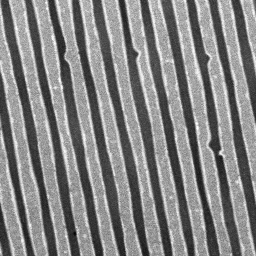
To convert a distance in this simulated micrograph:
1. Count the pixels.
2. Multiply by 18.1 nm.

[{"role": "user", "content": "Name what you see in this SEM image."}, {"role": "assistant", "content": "parallel lines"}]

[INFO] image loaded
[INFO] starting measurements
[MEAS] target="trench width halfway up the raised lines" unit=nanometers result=183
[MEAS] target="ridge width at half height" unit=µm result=0.232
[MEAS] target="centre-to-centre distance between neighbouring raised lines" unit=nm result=410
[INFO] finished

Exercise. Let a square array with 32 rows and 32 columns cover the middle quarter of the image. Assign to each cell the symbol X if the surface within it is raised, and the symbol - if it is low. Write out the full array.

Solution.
--XX---XXX---XXX---XX----XX---XX
--XX---XXX---XXX---XXX---XXX---X
--XXX--XXX---XXX---XXX---XXX---X
--XXX--XXX---XXX---XXX---XXX---X
--XXX---XXX--XXX----XX---XXX---X
--XXX---XXX---XX----XXX--XXX---X
--XXX---XXX---XXX---XXX---XXX--X
---XXX--XXX---XXX---XXX---XXX--X
---XXX---XX---XXX---XXX---XXX---
---XXX---XXX--XXX----XXX--XXX---
---XXX---XXX---XXX---XXX--XXX---
---XXX---XXX---XXX---XXX---XX---
----XX---XXX---XXX---XXX---XXX--
X---XXX---XXX--XXX----XX---XXX--
X---XXX---XXX--XXXX---XX---XXX--
X---XXX---XXX---XXX---XXX---XX--
X----XX---XXX---XXX---XXX---XXX-
X----XX---XXXX--XXX---XXX---XXX-
XX---XXX--XXXX---XX---XXX---XXX-
XX---XXX--XXXX---XXX---XX---XXX-
XX---XXX---XXX---XXX---XXX--XXX-
XX---XXX---XXX---XXX---XXX--XXXX
XXX--XXX---XXX----XX---XXX---XXX
XXX---XXX--XXXX---XX---XXX---XXX
XXX---XXX---XXX---XX---XXX---XXX
-XX---XXX---XXX---XXX--XXX---XXX
-XX---XXX---XXX---XXX---XXX--XXX
-XXX--XXX---XXX----XX---XXX---XX
-XXX---XX----XXX---XX---XXX---XX
-XXX---XXX---XXX---XX---XXX---XX
-XXX---XXX---XXX---XXX--XXXX--XX
-XXX---XXX---XXX---XXX---XXX--XX